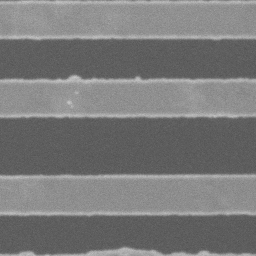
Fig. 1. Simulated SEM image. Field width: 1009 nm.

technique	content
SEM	lines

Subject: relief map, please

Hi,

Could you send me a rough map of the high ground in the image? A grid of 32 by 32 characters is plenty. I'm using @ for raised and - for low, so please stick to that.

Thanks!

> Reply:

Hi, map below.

@@@@@@@@@@@@@@@@@@@@@@@@@@@@@@@@
@@@@@@@@@@@@@@@@@@@@@@@@@@@@@@@@
@@@@@@@@@@@@@@@@@@@@@@@@@@@@@@@@
@@@@@@@@@@@@@@@@@@@@@@@@@@@@@@@@
@@@@@@@@@@@@@@@@@@@@@@@@@@@@@@@@
--------------------------------
--------------------------------
--------------------------------
--------------------------------
--------------------------------
@@@@@@@@@@@@@@@@@@@@@@@@@@@@@@@@
@@@@@@@@@@@@@@@@@@@@@@@@@@@@@@@@
@@@@@@@@@@@@@@@@@@@@@@@@@@@@@@@@
@@@@@@@@@@@@@@@@@@@@@@@@@@@@@@@@
@@@@@@@@@@@@@@@@@@@@@@@@@@@@@@@@
--------------------------------
--------------------------------
--------------------------------
--------------------------------
--------------------------------
--------------------------------
--------------------------------
@@@@@@@@@@@@@@@@@@@@@@@@@@@@@@@@
@@@@@@@@@@@@@@@@@@@@@@@@@@@@@@@@
@@@@@@@@@@@@@@@@@@@@@@@@@@@@@@@@
@@@@@@@@@@@@@@@@@@@@@@@@@@@@@@@@
@@@@@@@@@@@@@@@@@@@@@@@@@@@@@@@@
--------------------------------
--------------------------------
--------------------------------
--------------------------------
------------@@@@@@@-------------